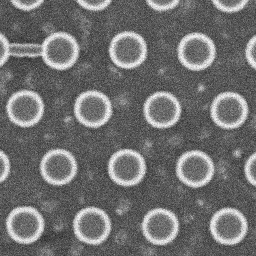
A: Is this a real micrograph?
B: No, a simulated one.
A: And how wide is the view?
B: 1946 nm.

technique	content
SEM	a regular array of raised bodies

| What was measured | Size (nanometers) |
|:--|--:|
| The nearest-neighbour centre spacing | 512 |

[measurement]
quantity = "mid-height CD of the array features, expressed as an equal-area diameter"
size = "0.26 um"